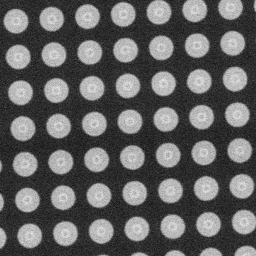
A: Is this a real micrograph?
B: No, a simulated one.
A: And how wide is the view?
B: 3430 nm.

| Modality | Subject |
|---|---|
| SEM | an array of small figures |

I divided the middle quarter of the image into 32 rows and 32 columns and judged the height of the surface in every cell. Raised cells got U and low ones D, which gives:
DDDDDDDDDDDDDDDDDDDDDDDDDDDDDDDD
DDDDDDDDDDDDDDDDDDDDDDDDDDDDDDDD
DDDDDDDDDDDDDDDDDDDDDDDUUUUDDDDU
DDDDDUUUDDDDDDUUUUDDDDUUUUUDDDDU
DDDDUUUUUDDDDUUUUUUDDDUUUUUUDDDU
UDDDUUUUUUDDDUUUUUUDDDUUUUUUDDDU
UDDDUUUUUUDDDUUUUUUDDDUUUUUDDDDD
UDDDUUUUUUDDDDUUUUDDDDDUUUDDDDDD
DDDDDUUUUDDDDDDDDDDDDDDDDDDDDDDD
DDDDDDDDDDDDDDDDDDDDDDDDDDDDDDDD
DDDDDDDDDDDDDDDDDDDDDDDDDDDDDDDD
DDDDDDDDDDDDDDDDDDDDDDDDUUUDDDDD
DDDDDDUUUDDDDDUUUUUDDDDUUUUUDDDD
UDDDDUUUUUDDDDUUUUUDDDDUUUUUDDDU
UDDDDUUUUUDDDDUUUUUDDDDUUUUUDDDD
UUDDDUUUUUUDDDUUUUUDDDDUUUUUDDDD
UDDDDUUUUUDDDDUUUUUDDDDDUUUDDDDD
UDDDDDUUUDDDDDDDDDDDDDDDDDDDDDDD
DDDDDDDDDDDDDDDDDDDDDDDDDDDDDDDD
DDDDDDDDDDDDDDDDDDDDDDDDDDDDDDDD
DDDDDDDDDDDDDDDDUUDDDDDDUUUUDDDD
DDDDDDUUUUDDDDDUUUUDDDDUUUUUUDDD
UDDDDDUUUUUDDDUUUUUUDDDUUUUUUDDD
UUDDDUUUUUUDDDUUUUUUDDDUUUUUUDDD
UUDDDUUUUUUDDDUUUUUUDDDDUUUUDDDD
UUDDDDUUUUUDDDDUUUUDDDDDDUUDDDDD
UDDDDDDUUUDDDDDDDDDDDDDDDDDDDDDD
DDDDDDDDDDDDDDDDDDDDDDDDDDDDDDDD
DDDDDDDDDDDDDDDDDDDDDDDDDDDDDDDD
DDDDDDDDDDDDDDDDDUUDDDDDDUUUUDDD
DDDDDDDUUUDDDDDUUUUUDDDDUUUUUDDD
UUDDDDUUUUUDDDDUUUUUDDDDUUUUUUDD